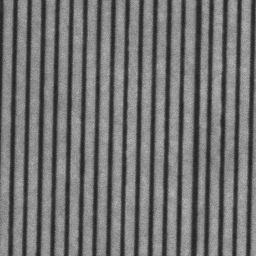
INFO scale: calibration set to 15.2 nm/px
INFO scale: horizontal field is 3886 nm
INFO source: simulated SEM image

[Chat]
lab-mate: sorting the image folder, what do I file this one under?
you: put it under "parallel lines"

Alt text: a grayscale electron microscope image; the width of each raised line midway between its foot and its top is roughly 100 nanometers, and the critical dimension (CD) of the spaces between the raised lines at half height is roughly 114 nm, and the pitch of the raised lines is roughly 14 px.